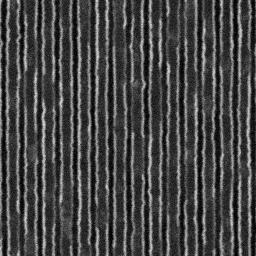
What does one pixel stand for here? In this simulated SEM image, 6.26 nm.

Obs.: parallel lines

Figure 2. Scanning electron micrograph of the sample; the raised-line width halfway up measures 0.0743 microns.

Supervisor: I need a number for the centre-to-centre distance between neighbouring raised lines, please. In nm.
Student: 111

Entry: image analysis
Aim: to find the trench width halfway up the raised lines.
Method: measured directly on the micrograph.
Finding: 36.8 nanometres